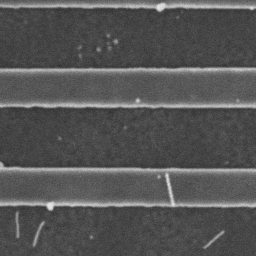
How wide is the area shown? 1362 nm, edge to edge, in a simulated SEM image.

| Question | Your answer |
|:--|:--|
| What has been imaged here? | lines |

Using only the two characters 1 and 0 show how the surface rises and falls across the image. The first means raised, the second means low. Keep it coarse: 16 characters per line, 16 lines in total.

0000000001100001
0000000000000000
0000000000000000
0000000000000000
1111111111111111
1111111111111111
1111111111111111
0000000000000000
0000000000000000
0000000000000000
1100000000000000
1111111111111111
1111111111111111
0000000000000000
0000000000000000
0000000000000000